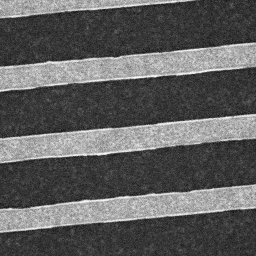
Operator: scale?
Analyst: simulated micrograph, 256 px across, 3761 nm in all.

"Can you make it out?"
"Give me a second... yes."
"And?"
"one or a few lines or trenches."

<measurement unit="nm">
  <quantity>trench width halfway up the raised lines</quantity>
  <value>717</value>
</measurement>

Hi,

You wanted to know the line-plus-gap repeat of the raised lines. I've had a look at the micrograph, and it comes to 1.03 µm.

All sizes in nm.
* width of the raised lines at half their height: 331